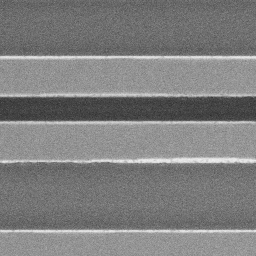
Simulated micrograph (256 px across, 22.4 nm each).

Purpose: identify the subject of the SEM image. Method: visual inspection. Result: lines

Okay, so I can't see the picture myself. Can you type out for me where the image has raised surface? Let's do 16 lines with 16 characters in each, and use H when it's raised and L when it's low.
LLLLLLLLLLLLLLLL
LLLLLLLLLLLLLLLL
LLLLLLLLLLLLLLLL
LLLLLLLLLLLLLLLL
HHHHHHHHHHHHHHHH
HHHHHHHHHHHHHHHH
LLLLLLLLLLLLLLLL
LLLLLLLLLLLLLLLL
HHHHHHHHHHHHHHHH
HHHHHHHHHHHHHHHH
LLLLLLLLLLLLLLLL
LLLLLLLLLLLLLLLL
LLLLLLLLLLLLLLLL
LLLLLLLLLLLLLLLL
HHHHHHHHHHHHHHHH
HHHHHHHHHHHHHHHH